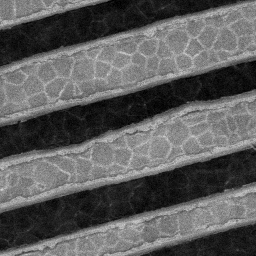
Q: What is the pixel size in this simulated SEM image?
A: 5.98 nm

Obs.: one or a few lines or trenches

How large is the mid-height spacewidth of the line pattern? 0.243 um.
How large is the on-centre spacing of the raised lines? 518 nanometers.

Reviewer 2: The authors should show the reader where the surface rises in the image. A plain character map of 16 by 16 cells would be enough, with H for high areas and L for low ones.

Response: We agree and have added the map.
HHHHLLLLLLLLLLHH
HLLLLLLLLLHHHHHH
LLLLLLHHHHHHHHHH
LLLHHHHHHHHHHHHH
HHHHHHHHHHHHLLLL
HHHHHHHHHLLLLLLL
HHHHLLLLLLLLLHHH
HLLLLLLLLLHHHHHH
LLLLLLLHHHHHHHHH
LLLHHHHHHHHHHHLL
HHHHHHHHHHLLLLLL
HHHHHHLLLLLLLLLL
HHLLLLLLLLLLLHHH
LLLLLLLLLHHHHHHH
LLLLLHHHHHHHHLLL
LLHHHHHHHLLLLLLL